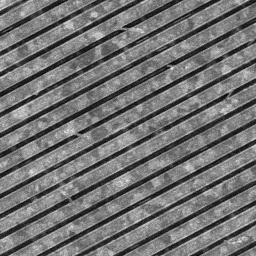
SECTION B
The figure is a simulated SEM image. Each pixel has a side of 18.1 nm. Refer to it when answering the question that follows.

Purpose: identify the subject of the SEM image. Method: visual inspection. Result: parallel lines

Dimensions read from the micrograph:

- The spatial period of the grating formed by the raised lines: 325 nm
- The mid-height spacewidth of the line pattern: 0.088 micrometres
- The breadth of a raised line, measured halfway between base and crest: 228 nm